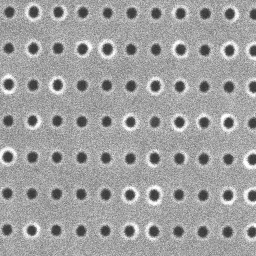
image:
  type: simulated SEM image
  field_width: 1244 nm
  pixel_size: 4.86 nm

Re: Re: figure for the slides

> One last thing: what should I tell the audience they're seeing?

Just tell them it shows a regular array of holes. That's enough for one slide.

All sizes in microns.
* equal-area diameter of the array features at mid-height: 0.054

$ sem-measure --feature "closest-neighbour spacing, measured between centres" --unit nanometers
119